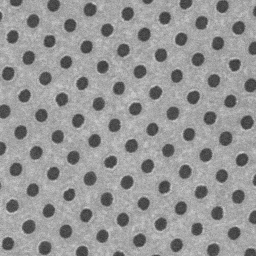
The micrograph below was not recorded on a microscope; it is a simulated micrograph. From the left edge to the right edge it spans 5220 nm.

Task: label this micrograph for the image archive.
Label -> a regular array of holes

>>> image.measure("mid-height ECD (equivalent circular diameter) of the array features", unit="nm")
278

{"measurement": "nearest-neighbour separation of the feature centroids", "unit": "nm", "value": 528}